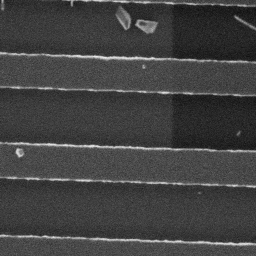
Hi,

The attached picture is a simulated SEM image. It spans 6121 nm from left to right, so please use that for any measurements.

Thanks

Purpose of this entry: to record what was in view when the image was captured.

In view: lines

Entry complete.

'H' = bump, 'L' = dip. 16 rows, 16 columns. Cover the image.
LLLLLLLLLLLLLLLL
LLLLLLLLLLLLLLLL
LLLLLLLLLLLLLLLL
HHHHHLLLLLLLLLLL
HHHHHHHHHHHHHHHH
LLHHHHHHHHHHHHHH
LLLLLLLLLLLLLLLL
LLLLLLLLLLLLLLLL
LLLLLLLLLLLLLLLL
HHHHHHHHHHHHHHHH
HHHHHHHHHHHHHHHH
LLLLLLLLLLLLHHHH
LLLLLLLLLLLLLLLL
LLLLLLLLLLLLLLLL
LLLLLLLLLLLLLLLL
HHHHHHHHHHHHHHHH